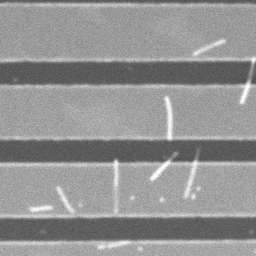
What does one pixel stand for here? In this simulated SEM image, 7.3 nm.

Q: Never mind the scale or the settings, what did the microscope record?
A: lines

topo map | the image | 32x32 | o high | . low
ooo.............................
oooooooooooooooooooooooooooooooo
oooooooooooooooooooooooooooooooo
oooooooooooooooooooooooooooooooo
oooooooooooooooooooooooooooooooo
oooooooooooooooooooooooooooooooo
oooooooooooooooooooooooooooooooo
oooooooooooooooooooooooooooooooo
................................
................................
...............................o
oooooooooooooooooooooooooooooooo
oooooooooooooooooooooooooooooooo
oooooooooooooooooooooooooooooooo
oooooooooooooooooooooooooooooooo
oooooooooooooooooooooooooooooooo
oooooooooooooooooooooooooooooooo
................................
................................
................................
oooooooooooooooooooooooooooooooo
oooooooooooooooooooooooooooooooo
oooooooooooooooooooooooooooooooo
oooooooooooooooooooooooooooooooo
oooooooooooooooooooooooooooooooo
oooooooooooooooooooooooooooooooo
oooooooooooooooooooooooooooooooo
................................
................................
................................
oooooooooooooooooooooooooooooooo
oooooooooooooooooooooooooooooooo